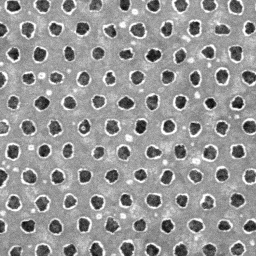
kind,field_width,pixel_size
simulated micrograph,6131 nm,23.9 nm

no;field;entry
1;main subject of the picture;a regular array of holes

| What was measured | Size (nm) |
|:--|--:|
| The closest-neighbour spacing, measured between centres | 634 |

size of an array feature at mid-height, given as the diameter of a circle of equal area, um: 0.329